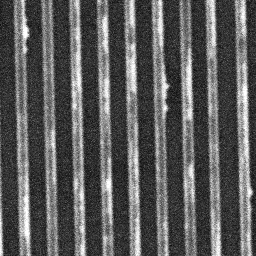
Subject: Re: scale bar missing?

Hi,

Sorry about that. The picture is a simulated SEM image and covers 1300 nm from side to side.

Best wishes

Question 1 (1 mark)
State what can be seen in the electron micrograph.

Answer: parallel lines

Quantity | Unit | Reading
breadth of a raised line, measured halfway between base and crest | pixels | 8.5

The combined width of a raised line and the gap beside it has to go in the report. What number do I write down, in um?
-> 0.14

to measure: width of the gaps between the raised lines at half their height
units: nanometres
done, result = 95.3